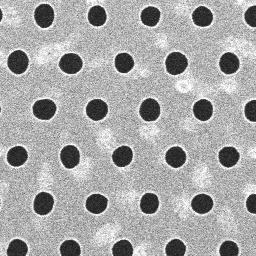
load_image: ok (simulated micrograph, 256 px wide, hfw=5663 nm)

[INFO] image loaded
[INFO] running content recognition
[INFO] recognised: a regular array of holes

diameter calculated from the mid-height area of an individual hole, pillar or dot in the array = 475 nanometres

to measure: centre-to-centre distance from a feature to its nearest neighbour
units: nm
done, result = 1170